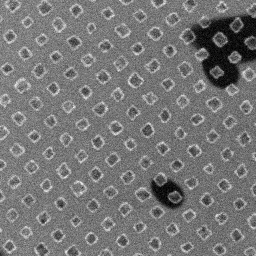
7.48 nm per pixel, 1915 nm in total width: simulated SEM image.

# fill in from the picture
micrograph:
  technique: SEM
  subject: a regular array of raised bodies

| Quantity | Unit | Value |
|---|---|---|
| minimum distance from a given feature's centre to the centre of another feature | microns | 0.167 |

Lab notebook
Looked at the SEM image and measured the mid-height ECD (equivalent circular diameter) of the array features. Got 86.7 nm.